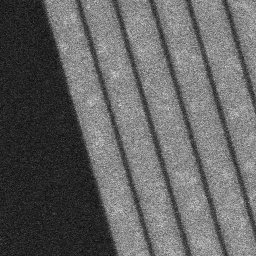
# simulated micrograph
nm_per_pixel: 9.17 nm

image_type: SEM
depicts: parallel lines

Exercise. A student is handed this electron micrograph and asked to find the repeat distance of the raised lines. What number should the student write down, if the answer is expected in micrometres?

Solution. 0.321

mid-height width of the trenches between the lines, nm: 256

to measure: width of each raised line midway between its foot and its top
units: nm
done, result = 68.2